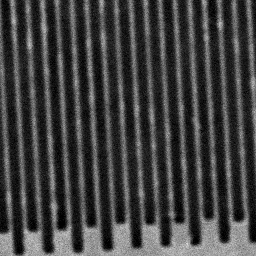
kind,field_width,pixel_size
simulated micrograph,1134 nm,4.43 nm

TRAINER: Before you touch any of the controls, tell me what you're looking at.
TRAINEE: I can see parallel lines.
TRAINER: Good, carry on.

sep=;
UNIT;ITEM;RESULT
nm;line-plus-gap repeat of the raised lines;65.2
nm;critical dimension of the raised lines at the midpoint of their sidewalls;16.6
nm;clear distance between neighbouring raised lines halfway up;45.8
